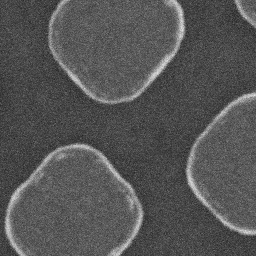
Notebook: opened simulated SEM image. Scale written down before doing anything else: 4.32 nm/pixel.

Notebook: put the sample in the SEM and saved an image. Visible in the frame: raised bodies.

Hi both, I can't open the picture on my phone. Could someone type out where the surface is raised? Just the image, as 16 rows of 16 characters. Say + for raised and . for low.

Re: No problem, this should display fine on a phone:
....+++++++....+
...++++++++.....
...++++++++.....
...++++++++.....
....++++++......
.....++++.......
..............++
.............+++
.............+++
...+++......++++
..+++++.....++++
..++++++....++++
.++++++++....+++
+++++++++.....++
.++++++++......+
.+++++++........